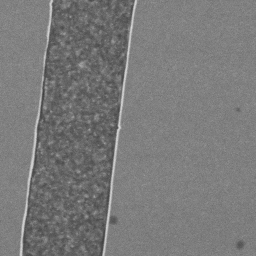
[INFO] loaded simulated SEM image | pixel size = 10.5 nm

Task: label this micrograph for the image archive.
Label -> one or a few lines or trenches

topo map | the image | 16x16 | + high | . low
+++.....++++++++
+++.....++++++++
+++.....++++++++
+++.....++++++++
+++.....++++++++
+++.....++++++++
++......++++++++
++.....+++++++++
++.....+++++++++
++.....+++++++++
++.....+++++++++
++.....+++++++++
++.....+++++++++
++.....+++++++++
+......+++++++++
+......+++++++++